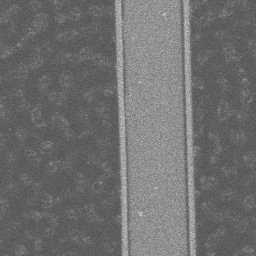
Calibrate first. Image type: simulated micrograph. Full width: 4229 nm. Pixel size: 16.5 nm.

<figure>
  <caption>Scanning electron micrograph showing one or a few lines or trenches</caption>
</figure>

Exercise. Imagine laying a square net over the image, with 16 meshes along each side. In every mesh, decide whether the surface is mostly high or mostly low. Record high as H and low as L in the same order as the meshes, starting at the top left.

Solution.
HHHHHHHLLLLLHHHH
HHHHHHHLLLLLHHHH
HHHHHHHLLLLLHHHH
HHHHHHHHLLLLHHHH
HHHHHHHHLLLLHHHH
HHHHHHHHLLLLHHHH
HHHHHHHHLLLLHHHH
HHHHHHHHLLLLHHHH
HHHHHHHHLLLLHHHH
HHHHHHHHLLLLHHHH
HHHHHHHHLLLLHHHH
HHHHHHHHLLLLHHHH
HHHHHHHHLLLLHHHH
HHHHHHHHLLLLHHHH
HHHHHHHHLLLLHHHH
HHHHHHHHLLLLHHHH